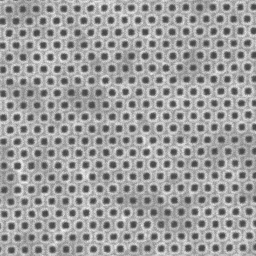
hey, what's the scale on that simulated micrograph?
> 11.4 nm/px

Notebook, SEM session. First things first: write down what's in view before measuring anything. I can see a regular array of holes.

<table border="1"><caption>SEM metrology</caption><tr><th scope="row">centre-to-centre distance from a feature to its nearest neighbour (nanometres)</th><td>152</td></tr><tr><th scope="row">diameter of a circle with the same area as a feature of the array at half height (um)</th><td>0.0921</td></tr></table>